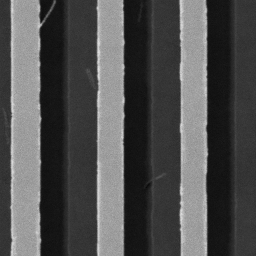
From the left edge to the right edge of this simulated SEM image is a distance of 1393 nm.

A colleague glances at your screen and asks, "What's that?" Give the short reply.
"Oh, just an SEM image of lines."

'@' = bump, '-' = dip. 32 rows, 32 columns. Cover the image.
@@@@@----@@@@@@----@@@@@@@---@@@
@@@@@----@@@@@@----@@@@@@@---@@@
@@@@@----@@@@@@----@@@@@@@---@@@
@@@@@----@@@@@@----@@@@@@@---@@@
@@@@@----@@@@@@----@@@@@@@---@@@
@@@@@----@@@@@@@---@@@@@@@---@@@
@@@@@----@@@@@@----@@@@@@@---@@@
@@@@@----@@@@@@----@@@@@@@---@@@
@@@@@----@@@@@@@---@@@@@@@---@@@
@@@@@----@@@@@@@---@@@@@@@---@@@
@@@@@----@@@@@@----@@@@@@@---@@@
@@@@@----@@@@@@@---@@@@@@@---@@@
@@@@@----@@@@@@@---@@@@@@@---@@@
@@@@@----@@@@@@@---@@@@@@@---@@@
@@@@@----@@@@@@@---@@@@@@@---@@@
@@@@@----@@@@@@----@@@@@@@---@@@
@@@@@----@@@@@@----@@@@@@@---@@@
@@@@@----@@@@@@----@@@@@@@---@@@
@@@@@----@@@@@@----@@@@@@@---@@@
@@@@@----@@@@@@----@@@@@@@---@@@
@@@@@----@@@@@@----@@@@@@@---@@@
@@@@@----@@@@@@----@@@@@@@---@@@
@@@@@----@@@@@@@---@@@@@@@---@@@
@@@@@----@@@@@@----@@@@@@@---@@@
@@@@@----@@@@@@----@@@@@@@---@@@
@@@@@----@@@@@@----@@@@@@@---@@@
@@@@@----@@@@@@----@@@@@@@---@@@
@@@@@----@@@@@@----@@@@@@@---@@@
@@@@@----@@@@@@----@@@@@@@---@@@
@@@@@----@@@@@@----@@@@@@@---@@@
@@@@@----@@@@@@----@@@@@@@---@@@
@@@@@----@@@@@@----@@@@@@@---@@@